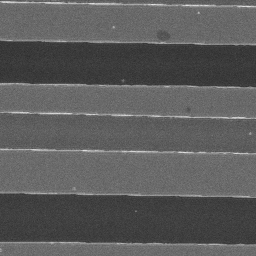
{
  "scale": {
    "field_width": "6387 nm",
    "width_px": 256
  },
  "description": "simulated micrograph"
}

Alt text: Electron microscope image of lines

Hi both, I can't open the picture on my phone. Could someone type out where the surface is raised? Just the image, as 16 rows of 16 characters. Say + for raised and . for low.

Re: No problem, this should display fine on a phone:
++++++++++++++++
++++++++++++++++
++++++++++++++++
................
................
++++++++++++++++
++++++++++++++++
++++++++++++++++
++++++++++++++++
++++++++++++++++
++++++++++++++++
++++++++++++++++
................
................
................
++++++++++++++++